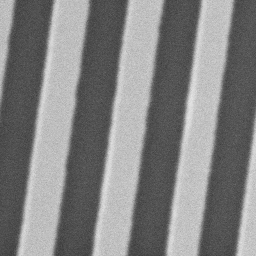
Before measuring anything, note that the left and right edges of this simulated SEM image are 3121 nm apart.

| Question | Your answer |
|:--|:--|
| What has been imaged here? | lines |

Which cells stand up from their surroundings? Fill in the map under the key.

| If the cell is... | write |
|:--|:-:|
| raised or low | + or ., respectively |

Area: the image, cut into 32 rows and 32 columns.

++.....++++.....++++.....++++...
++.....++++.....++++.....++++...
+......++++.....++++.....++++...
+.....+++++.....++++.....++++...
+.....++++......++++.....+++....
+.....++++.....++++......+++....
+.....++++.....++++.....++++....
+.....++++.....++++.....++++....
+.....++++.....++++.....++++....
......++++.....++++.....++++....
......++++.....++++.....++++....
.....++++......++++.....+++.....
.....++++.....+++++.....+++.....
.....++++.....++++......+++.....
.....++++.....++++.....++++.....
.....++++.....++++.....++++.....
.....++++.....++++.....++++.....
....+++++.....++++.....++++.....
....+++++.....++++.....++++.....
....++++.....+++++.....+++......
....++++.....++++.....++++.....+
....++++.....++++.....++++.....+
....++++.....++++.....++++.....+
....++++.....++++.....++++.....+
...+++++.....++++.....++++.....+
...++++......++++.....+++......+
...++++.....++++......+++.....++
...++++.....++++.....++++.....++
...++++.....++++.....++++.....++
...++++.....++++.....++++.....++
...++++.....++++.....++++.....++
..+++++.....++++.....++++.....++